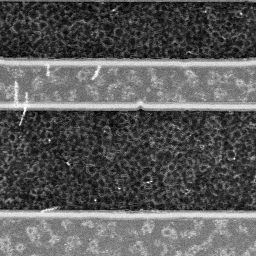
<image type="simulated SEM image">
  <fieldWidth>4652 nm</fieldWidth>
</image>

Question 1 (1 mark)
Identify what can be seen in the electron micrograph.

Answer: one or a few lines or trenches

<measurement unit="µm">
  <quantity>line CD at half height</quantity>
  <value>0.781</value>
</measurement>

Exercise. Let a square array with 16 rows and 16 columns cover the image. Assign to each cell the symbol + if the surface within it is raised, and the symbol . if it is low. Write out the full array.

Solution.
................
................
................
................
++++++++++++++++
++++++++++++++++
++++++++++++++++
................
................
................
................
................
................
++++++++++++++++
++++++++++++++++
++++++++++++++++